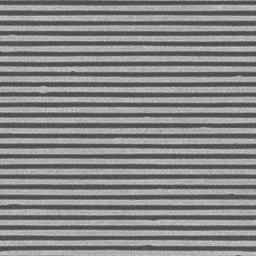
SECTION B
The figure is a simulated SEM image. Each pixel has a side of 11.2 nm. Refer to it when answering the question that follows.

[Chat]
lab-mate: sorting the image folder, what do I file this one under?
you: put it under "parallel lines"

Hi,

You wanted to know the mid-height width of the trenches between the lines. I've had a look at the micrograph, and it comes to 50.2 nanometers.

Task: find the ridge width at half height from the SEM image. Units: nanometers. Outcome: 60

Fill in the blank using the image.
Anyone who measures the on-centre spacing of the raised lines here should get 114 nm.